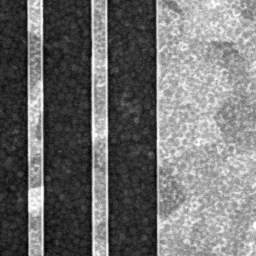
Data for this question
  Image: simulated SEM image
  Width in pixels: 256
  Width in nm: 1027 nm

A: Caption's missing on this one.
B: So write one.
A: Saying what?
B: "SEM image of one or a few lines or trenches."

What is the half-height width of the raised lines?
0.0557 micrometres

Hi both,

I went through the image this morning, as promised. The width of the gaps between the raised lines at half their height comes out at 203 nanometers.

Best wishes